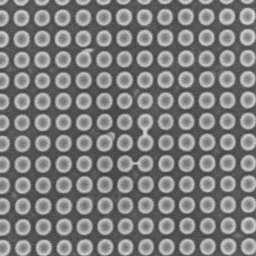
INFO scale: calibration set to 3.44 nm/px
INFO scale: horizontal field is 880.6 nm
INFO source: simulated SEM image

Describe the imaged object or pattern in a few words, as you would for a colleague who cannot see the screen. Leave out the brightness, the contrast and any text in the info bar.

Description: a regular array of raised bodies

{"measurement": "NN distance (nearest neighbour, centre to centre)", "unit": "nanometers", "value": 69.6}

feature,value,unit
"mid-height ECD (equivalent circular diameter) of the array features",53.3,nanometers